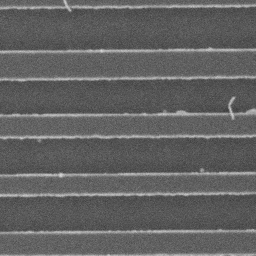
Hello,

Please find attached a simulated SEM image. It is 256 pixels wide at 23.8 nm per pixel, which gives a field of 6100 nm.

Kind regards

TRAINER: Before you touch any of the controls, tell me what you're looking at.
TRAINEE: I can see lines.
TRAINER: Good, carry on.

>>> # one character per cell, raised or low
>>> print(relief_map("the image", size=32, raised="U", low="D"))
UUUUUUUUUUUUUUUUUUUUUUUUUUUUUUUU
DDDDDDDDDDDDDDDDDDDDDDDDDDDDDDDD
DDDDDDDDDDDDDDDDDDDDDDDDDDDDDDDD
DDDDDDDDDDDDDDDDDDDDDDDDDDDDDDDD
DDDDDDDDDDDDDDDDDDDDDDDDDDDDDDDD
DDDDDDDDDDDDDDDDDDDDDDDDDDDDDDDD
UUUUUUUUUUUUUUUUUUUUUUUUUUUUUUUU
UUUUUUUUUUUUUUUUUUUUUUUUUUUUUUUU
UUUUUUUUUUUUUUUUUUUUUUUUUUUUUUUU
UUUUUUUUUUUUUUUUUUUUUUUUUUUUUUUU
DDDDDDDDDDDDDDDDDDDDDDDDDDDDDDDD
DDDDDDDDDDDDDDDDDDDDDDDDDDDDDDDD
DDDDDDDDDDDDDDDDDDDDDDDDDDDDDDDD
DDDDDDDDDDDDDDDDDDDDDDDDDDDDDDDD
UUUUUUUUUUUUUUUUUUUUUUUUUUUUUUUU
UUUUUUUUUUUUUUUUUUUUUUUUUUUUUUUU
UUUUUUUUUUUUUUUUUUUUUUUUUUUUUUUU
DDDDDDDDDDDDDDDDDDDDDDDDDDDDDDDD
DDDDDDDDDDDDDDDDDDDDDDDDDDDDDDDD
DDDDDDDDDDDDDDDDDDDDDDDDDDDDDDDD
DDDDDDDDDDDDDDDDDDDDDDDDDDDDDDDD
DDDDDDDDDDDDDDDDDDDDDDDDDDDDDDDD
UUUUUUUUUUUUUUUUUUUUUUUUUUUUUUUU
UUUUUUUUUUUUUUUUUUUUUUUUUUUUUUUU
UUUUUUUUDDDDDDDDDDDDDDDDDDDDDDDD
DDDDDDDDDDDDDDDDDDDDDDDDDDDDDDDD
DDDDDDDDDDDDDDDDDDDDDDDDDDDDDDDD
DDDDDDDDDDDDDDDDDDDDDDDDDDDDDDDD
DDDDDDDDDDDDDDDDDDDDDDDDDDDDDDDD
UUUUUUUUUUUUUUUUUUUUUUUUUUUUUUUU
UUUUUUUUUUUUUUUUUUUUUUUUUUUUUUUU
UUUUUUUUUUUUUUUUUUUUUUUUUUUUUUUU